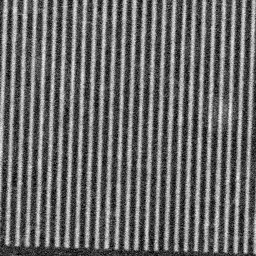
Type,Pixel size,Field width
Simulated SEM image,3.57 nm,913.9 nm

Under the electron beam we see parallel lines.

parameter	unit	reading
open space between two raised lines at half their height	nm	24.1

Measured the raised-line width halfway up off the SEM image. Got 12 nm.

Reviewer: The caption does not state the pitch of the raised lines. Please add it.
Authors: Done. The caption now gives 35.5 nanometers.